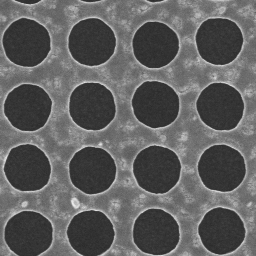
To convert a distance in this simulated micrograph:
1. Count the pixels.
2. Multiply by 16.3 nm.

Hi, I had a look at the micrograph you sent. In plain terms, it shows a regular array of holes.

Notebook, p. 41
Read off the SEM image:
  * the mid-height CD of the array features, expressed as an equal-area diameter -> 774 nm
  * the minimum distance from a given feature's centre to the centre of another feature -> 1020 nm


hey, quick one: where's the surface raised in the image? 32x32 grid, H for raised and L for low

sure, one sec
HHHLHHHHHHHHHHHHHHHHHHHHHHHHHHHH
HHHHHHHHHHHHHHHHHHHHHHHHHHHHHHHH
HHLLHHHHHHLLLHHHHHHHHHHHHHLLLHHH
HLLLLLHHHLLLLLHHHLLLLHHHHLLLLLHH
LLLLLLHHHLLLLLHHHLLLLLHHLLLLLLHH
LLLLLLHHLLLLLLHHHLLLLLHHLLLLLLHH
HLLLLLHHHLLLLLHHHLLLLLHHHLLLLLHH
HLLLLHHHHLLLLHHHHLLLLLHHHHLLLHHH
HHHHHHHHHHHHHHHHHHHLHHHHHHHHHHHH
HHHHHHHHHHHHHHHHHHHHHHHHHHHHHHHH
HHHLHHHHHHLLLHHHHHLLLHHHHHLLHHHH
HLLLLLHHHLLLLLHHHLLLLLHHHLLLLLHH
HLLLLLHHHLLLLLHHHLLLLLHHHLLLLLHH
LLLLLLHHHLLLLLHHHLLLLLHHHLLLLLHH
HLLLLLHHHLLLLLHHHLLLLLHHHLLLLLHH
HLLLLLHHHHLLLLHHHHLLLHHHHHLLLLHH
HHHHHHHHHHHHHHHHHHHHHHHHHHHHHHHH
HHHHHHHHHHHHHHHHHHHHHHHHHHHHHHHH
HHLLLHHHHHLLHHHHHHLLLHHHHHLLLHHH
HLLLLLHHHLLLLLHHHLLLLLHHHLLLLLHH
HLLLLLHHHLLLLLHHHLLLLLLHHLLLLLLH
HLLLLLHHHLLLLLLHHLLLLLLHHLLLLLLH
HLLLLLHHHLLLLLHHHLLLLLHHHLLLLLHH
HHLLLHHHHHLLLLHHHHLLLHHHHHLLLHHH
HHHHHHHHHHHHHHHHHHHHHHHHHHHHHHHH
HHHHHHHHHHHHHHHHHHHHHHHHHHHHHHHH
HHHLLHHHHHLLLHHHHHLLLHHHHHLLLHHH
HLLLLLHHHLLLLLHHHLLLLLHHHLLLLLHH
HLLLLLLHLLLLLLHHHLLLLLHHHLLLLLLH
HLLLLLLHLLLLLLHHHLLLLLHHHLLLLLLH
HLLLLLHHHLLLLLHHHLLLLLHHHLLLLLHH
HHLLLHHHHHLLLHHHHHLLLHHHHHLLLHHH